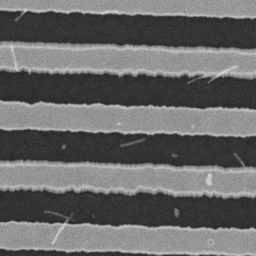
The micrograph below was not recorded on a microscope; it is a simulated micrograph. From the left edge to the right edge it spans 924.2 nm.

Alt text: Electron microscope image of lines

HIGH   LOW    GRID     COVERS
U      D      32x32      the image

UUUUUUUUUUUUUUUUUUUUUUUUUUUUUUUU
DDDDDDDUUDUUUUUUUUUUUUUUUUUUUUUU
DDDDDDDDDDDDDDDDDDDDDDDDDDDDDDDD
DDDDDDDDDDDDDDDDDDDDDDDDDDDDDDDD
DDDDDDDDDDDDDDDDDDDDDDDDDDDDDDDD
UDDDDDDDDDDDDDDDDDDDDDDDDDDDDDDD
UUUUUUUUUUUUUUUUUUUUUUUUUUUUUUUU
UUUUUUUUUUUUUUUUUUUUUUUUUUUUUUUU
UUUUUUUUUUUUUUUUUUUUUUUUUUUUUUUU
DDDDDDDDDDDDDDDDDDDDDDDDDUUUDDUU
DDDDDDDDDDDDDDDDDDDDDDDDDDDDDDDD
DDDDDDDDDDDDDDDDDDDDDDDDDDDDDDDD
DDDDDDDDDDDDDDDDDDDDDDDDDDDDDDDD
UUUUUUUUUUUUUUUUUUUUUUUUUDUUUDDD
UUUUUUUUUUUUUUUUUUUUUUUUUUUUUUUU
UUUUUUUUUUUUUUUUUUUUUUUUUUUUUUUU
DDDDDDDDDDDUUUUUUUUUUUUUUUUUUUUU
DDDDDDDDDDDDDDDDDDDDDDDDDDDDDDDD
DDDDDDDDDDDDDDDDDDDDDDDDDDDDDDDD
DDDDDDDDDDDDDDDDDDDDDDDDDDDDDDDD
UUUUUUUUDDUUDDDDDDDDDDDDDDDDDDDD
UUUUUUUUUUUUUUUUUUUUUUUUUUUUUUUU
UUUUUUUUUUUUUUUUUUUUUUUUUUUUUUUU
UUUUUUUUUUUUUUUUUUUUUUUUUUUUUUUU
DDDDDDDDDDDDDDDDDDDDDDDDDDDDUUDD
DDDDDDDDDDDDDDDDDDDDDDDDDDDDDDDD
DDDDDDDDDDDDDDDDDDDDDDDDDDDDDDDD
DDDDDDDDDDDDDDDDDDDDDDDDDDDDDDDD
UUUUUUUUUUUUUUUUUUUUUUUUDUDDDDDD
UUUUUUUUUUUUUUUUUUUUUUUUUUUUUUUU
UUUUUUUUUUUUUUUUUUUUUUUUUUUUUUUU
DDDDDDDDUDDDDDDUUUUUUUUUUUUUUUUU